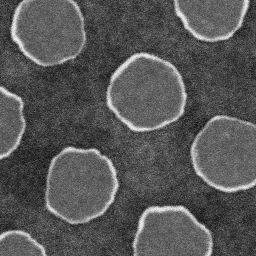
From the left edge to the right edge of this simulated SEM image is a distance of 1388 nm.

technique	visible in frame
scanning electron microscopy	raised bodies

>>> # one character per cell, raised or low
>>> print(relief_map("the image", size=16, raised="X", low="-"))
-XXXX------XXXX-
-XXXX-------XXX-
-XXXX-----------
--XXX-----------
-------XXXX-----
-------XXXX-----
X------XXXX-----
X-------XXX--XX-
X-----------XXXX
X---XX------XXXX
---XXXX-----XXXX
---XXXX------XXX
---XXXX---------
----XX---XXX----
---------XXXX---
XXX-----XXXXX---